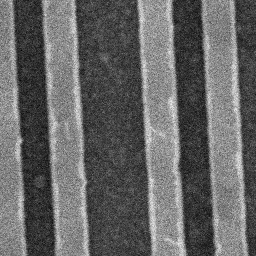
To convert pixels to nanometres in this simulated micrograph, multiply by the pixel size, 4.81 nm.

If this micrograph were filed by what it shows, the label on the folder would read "one or a few lines or trenches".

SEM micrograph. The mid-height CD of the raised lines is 29.8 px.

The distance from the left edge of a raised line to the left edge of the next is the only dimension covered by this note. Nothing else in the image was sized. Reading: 0.381 microns